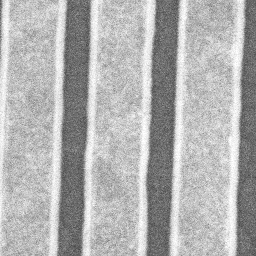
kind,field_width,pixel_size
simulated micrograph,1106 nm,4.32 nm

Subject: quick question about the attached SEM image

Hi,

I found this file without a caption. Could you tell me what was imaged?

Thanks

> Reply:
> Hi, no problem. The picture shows one or a few lines or trenches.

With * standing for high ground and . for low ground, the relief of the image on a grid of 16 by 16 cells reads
****..***..****.
****..***..****.
****..***..****.
****..***..****.
****..***..****.
****..***..****.
****..***..****.
****..***..****.
****..***..****.
****..***..****.
****..***..****.
****..***..****.
***..****..****.
***..****..****.
***..****..****.
***..****..****.